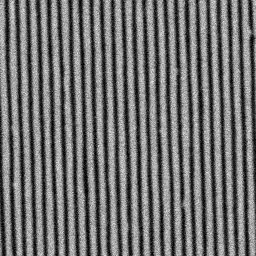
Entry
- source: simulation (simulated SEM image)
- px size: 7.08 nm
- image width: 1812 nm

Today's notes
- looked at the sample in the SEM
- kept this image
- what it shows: parallel lines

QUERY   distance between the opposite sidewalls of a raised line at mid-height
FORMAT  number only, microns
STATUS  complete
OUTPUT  0.0442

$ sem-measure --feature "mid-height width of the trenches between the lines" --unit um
0.0318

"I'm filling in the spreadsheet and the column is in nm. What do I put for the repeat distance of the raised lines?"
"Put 75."